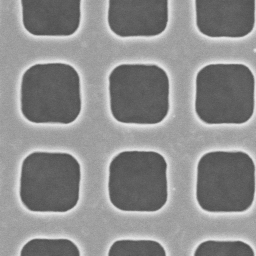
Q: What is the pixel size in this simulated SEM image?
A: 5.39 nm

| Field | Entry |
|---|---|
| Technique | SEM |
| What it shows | holes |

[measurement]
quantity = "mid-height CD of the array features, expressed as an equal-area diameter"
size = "349 nm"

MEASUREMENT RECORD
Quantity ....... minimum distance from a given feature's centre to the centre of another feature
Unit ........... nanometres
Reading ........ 472